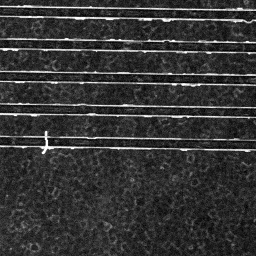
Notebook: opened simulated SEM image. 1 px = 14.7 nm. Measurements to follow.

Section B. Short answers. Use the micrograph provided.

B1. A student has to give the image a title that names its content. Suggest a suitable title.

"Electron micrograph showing parallel lines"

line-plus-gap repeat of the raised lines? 475 nm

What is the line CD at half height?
344 nm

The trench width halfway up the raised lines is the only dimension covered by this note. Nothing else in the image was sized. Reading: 139 nanometres